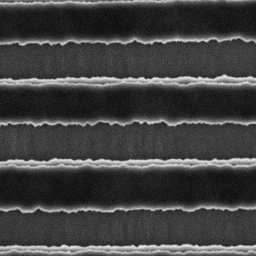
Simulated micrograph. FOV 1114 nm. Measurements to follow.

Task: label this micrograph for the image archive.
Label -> lines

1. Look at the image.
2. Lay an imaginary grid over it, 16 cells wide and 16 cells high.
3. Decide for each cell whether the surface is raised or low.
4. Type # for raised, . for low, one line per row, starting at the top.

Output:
################
################
##############.#
................
................
################
################
################
................
................
################
################
################
................
................
################